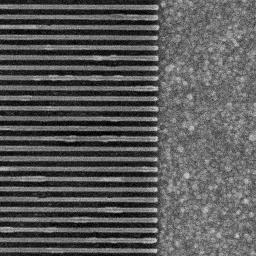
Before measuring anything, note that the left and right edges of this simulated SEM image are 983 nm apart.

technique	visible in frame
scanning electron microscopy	parallel lines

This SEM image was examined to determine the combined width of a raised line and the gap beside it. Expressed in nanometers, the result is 38.9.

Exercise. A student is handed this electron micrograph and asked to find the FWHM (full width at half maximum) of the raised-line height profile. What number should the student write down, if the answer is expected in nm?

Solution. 14.4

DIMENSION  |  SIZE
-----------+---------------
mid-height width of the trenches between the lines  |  0.0245 micrometres